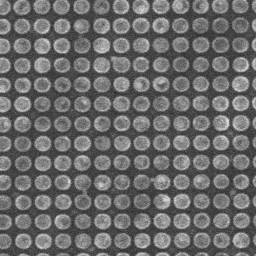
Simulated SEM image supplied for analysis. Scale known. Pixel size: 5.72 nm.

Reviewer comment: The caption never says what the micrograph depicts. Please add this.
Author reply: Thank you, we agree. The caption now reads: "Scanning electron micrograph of a regular array of raised bodies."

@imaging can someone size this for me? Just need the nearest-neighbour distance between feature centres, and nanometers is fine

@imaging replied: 111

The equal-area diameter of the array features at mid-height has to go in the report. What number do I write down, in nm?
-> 87.1